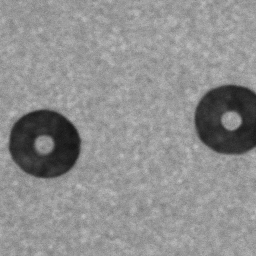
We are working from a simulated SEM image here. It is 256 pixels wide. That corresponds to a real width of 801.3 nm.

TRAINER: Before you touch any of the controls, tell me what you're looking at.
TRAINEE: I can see ring-shaped grooves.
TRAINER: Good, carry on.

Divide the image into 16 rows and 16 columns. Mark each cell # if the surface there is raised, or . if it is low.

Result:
################
################
################
################
################
#############..#
############....
#...########..#.
#....#######....
#....#########..
#...############
################
################
################
################
################